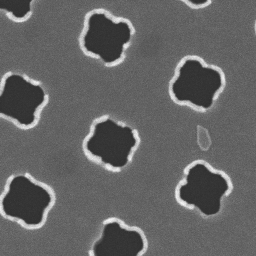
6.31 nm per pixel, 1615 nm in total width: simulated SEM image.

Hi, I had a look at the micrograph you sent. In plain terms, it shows holes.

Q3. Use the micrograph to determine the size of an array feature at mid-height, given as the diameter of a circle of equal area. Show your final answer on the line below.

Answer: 282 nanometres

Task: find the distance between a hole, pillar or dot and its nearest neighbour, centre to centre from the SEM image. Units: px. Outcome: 103